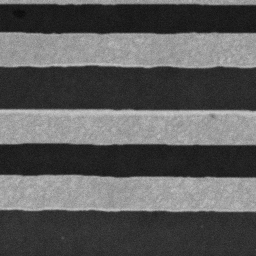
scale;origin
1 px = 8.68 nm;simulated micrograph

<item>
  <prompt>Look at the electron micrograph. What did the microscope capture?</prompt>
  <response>lines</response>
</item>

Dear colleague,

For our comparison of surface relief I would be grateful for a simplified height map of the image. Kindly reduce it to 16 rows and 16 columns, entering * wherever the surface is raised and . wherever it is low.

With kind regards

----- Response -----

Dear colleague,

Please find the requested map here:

................
................
****************
****************
................
................
................
****************
****************
................
................
****************
****************
................
................
................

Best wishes